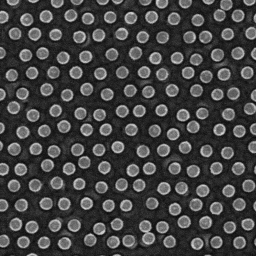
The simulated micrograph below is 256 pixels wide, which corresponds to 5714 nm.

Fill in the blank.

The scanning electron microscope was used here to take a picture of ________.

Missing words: a regular array of raised bodies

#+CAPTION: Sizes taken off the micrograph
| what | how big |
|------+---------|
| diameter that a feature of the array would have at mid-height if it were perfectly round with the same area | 264 nm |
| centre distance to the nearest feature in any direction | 402 nm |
